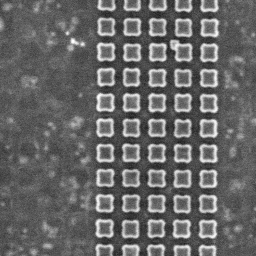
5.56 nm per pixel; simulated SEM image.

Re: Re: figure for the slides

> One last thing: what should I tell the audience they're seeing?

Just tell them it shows a regular array of raised bodies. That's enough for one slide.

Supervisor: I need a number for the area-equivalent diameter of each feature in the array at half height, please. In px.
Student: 18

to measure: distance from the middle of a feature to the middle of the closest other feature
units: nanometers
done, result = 139